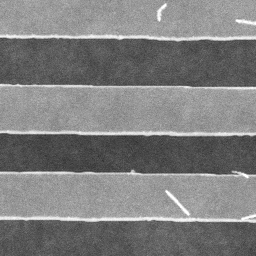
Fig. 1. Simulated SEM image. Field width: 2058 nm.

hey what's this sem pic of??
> lines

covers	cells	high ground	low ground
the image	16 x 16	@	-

@@@@@@@@@@@@@@@@
@@@@@@@@@@@@@@@@
----------------
----------------
----------------
@@@@@@@@@@@@@@@@
@@@@@@@@@@@@@@@@
@@@@@@@@@@@@@@@@
----------------
----------------
----------------
@@@@@@@@@@@@@@@@
@@@@@@@@@@@@@@@@
@@@@@@@@@@@@@@@@
----------------
----------------